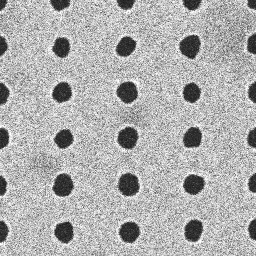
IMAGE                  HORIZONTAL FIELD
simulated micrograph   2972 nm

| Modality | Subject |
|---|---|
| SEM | a regular array of holes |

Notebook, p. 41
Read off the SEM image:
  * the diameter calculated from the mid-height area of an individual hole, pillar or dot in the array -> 240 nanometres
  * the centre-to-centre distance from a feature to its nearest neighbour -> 534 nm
